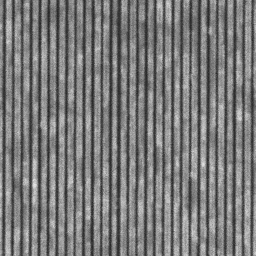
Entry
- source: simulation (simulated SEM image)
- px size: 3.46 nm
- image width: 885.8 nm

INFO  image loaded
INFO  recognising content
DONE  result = parallel lines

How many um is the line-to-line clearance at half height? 0.013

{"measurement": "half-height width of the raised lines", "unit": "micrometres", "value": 0.0194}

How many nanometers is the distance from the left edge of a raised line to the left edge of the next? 30.6